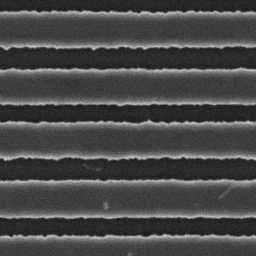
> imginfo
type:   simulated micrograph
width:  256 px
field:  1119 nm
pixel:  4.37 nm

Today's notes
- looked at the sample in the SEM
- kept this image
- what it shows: lines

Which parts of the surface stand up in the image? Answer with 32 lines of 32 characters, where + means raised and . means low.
................................
..+++++.++++....+.....+++++..+..
++++++++++++++++++++++++++++++++
++++++++++++++++++++++++++++++++
++++++++++++++++++++++++++++++++
++++++++++++++++++++++++++++++++
................................
................................
................................
++++++++++++++++++++++++++++++++
++++++++++++++++++++++++++++++++
++++++++++++++++++++++++++++++++
++++++++++++++++++++++++++++++++
................................
................................
++++++++++++++++++++++++++++++++
++++++++++++++++++++++++++++++++
++++++++++++++++++++++++++++++++
++++++++++++++++++++++++++++++++
++++++++++++++++++++++++++++++++
................................
................................
....................++.....++...
++++++++++++++++++++++++++++++++
++++++++++++++++++++++++++++++++
++++++++++++++++++++++++++++++++
++++++++++++++++++++++++++++++++
................................
................................
..+...+......+.....++++++.+.+...
++++++++++++++++++++++++++++++++
++++++++++++++++++++++++++++++++